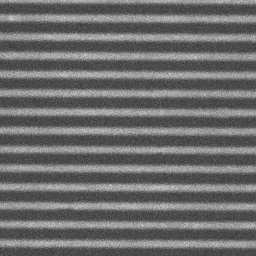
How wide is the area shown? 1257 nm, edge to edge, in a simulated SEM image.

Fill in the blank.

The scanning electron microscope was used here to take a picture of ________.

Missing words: parallel lines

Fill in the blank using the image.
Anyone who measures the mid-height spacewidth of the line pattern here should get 62.7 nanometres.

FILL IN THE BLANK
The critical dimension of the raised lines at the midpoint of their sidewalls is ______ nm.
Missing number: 29.5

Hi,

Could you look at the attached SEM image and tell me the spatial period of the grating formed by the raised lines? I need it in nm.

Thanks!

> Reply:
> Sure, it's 92.2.